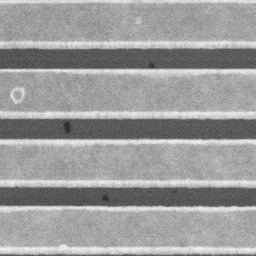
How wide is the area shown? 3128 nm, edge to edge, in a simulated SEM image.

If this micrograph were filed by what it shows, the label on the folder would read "lines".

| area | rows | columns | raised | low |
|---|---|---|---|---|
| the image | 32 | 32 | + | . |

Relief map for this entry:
++++++++++++++++++++++++++++++++
++++++++++++++++++++++++++++++++
++++++++++++++++++++++++++++++++
++++++++++++++++++++++++++++++++
++++++++++++++++++++++++++++++++
++++++++++++++++++++++++++++++++
................................
................................
................................
++++++++++++++++++++++++++++++++
++++++++++++++++++++++++++++++++
++++++++++++++++++++++++++++++++
++++++++++++++++++++++++++++++++
++++++++++++++++++++++++++++++++
................................
................................
................................
+++.+++++++++++++++++++.++++++++
++++++++++++++++++++++++++++++++
++++++++++++++++++++++++++++++++
++++++++++++++++++++++++++++++++
++++++++++++++++++++++++++++++++
++++++++++++++++++++++++++++++++
................................
................................
................................
++++++++++++++++++++++++++++++++
++++++++++++++++++++++++++++++++
++++++++++++++++++++++++++++++++
++++++++++++++++++++++++++++++++
++++++++++++++++++++++++++++++++
................................